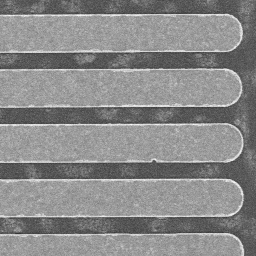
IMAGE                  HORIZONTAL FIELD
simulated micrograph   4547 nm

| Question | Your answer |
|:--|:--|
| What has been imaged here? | parallel lines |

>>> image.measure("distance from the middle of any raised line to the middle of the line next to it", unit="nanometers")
976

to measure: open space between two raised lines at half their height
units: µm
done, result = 0.306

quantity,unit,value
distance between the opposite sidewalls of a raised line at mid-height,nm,659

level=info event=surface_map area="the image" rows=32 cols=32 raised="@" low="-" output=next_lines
--------------------------------
--------------------------------
@@@@@@@@@@@@@@@@@@@@@@@@@@@@@@--
@@@@@@@@@@@@@@@@@@@@@@@@@@@@@@--
@@@@@@@@@@@@@@@@@@@@@@@@@@@@@@--
@@@@@@@@@@@@@@@@@@@@@@@@@@@@@@--
--------------------------------
--------------------------------
--------------------------------
@@@@@@@@@@@@@@@@@@@@@@@@@@@@@@--
@@@@@@@@@@@@@@@@@@@@@@@@@@@@@@--
@@@@@@@@@@@@@@@@@@@@@@@@@@@@@@--
@@@@@@@@@@@@@@@@@@@@@@@@@@@@@@--
--------------------------------
--------------------------------
--------------------------------
@@@@@@@@@@@@@@@@@@@@@@@@@@@@@@--
@@@@@@@@@@@@@@@@@@@@@@@@@@@@@@--
@@@@@@@@@@@@@@@@@@@@@@@@@@@@@@--
@@@@@@@@@@@@@@@@@@@@@@@@@@@@@@--
--------------------------------
--------------------------------
@-----------------@@@@@@@@@@@---
@@@@@@@@@@@@@@@@@@@@@@@@@@@@@@--
@@@@@@@@@@@@@@@@@@@@@@@@@@@@@@--
@@@@@@@@@@@@@@@@@@@@@@@@@@@@@@--
@@@@@@@@@@@@@@@@@@@@@@@@@@@@@@--
--------------------------------
--------------------------------
@@@@@@@@@@@@@@@@@@@@@@@@@@@@@---
@@@@@@@@@@@@@@@@@@@@@@@@@@@@@@--
@@@@@@@@@@@@@@@@@@@@@@@@@@@@@@--